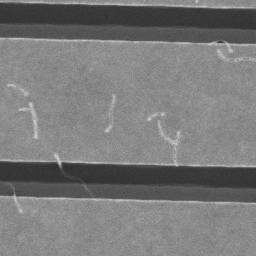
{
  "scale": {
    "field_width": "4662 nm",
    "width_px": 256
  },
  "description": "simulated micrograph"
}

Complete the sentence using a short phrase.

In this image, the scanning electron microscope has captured lines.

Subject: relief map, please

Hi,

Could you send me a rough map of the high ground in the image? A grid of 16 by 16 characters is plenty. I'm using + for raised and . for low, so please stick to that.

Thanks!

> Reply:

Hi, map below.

................
................
+++++...........
++++++++++++++++
++++++++++++++++
++++++++++++++++
++++++++++++++++
++++++++++++++++
++++++++++++++++
++++++++++++++++
................
................
+++++++++.......
++++++++++++++++
++++++++++++++++
++++++++++++++++